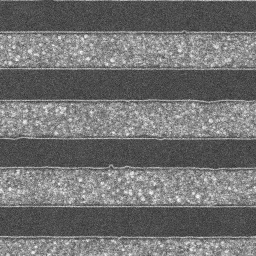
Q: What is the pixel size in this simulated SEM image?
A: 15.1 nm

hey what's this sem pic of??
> one or a few lines or trenches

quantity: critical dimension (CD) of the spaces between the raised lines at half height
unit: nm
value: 575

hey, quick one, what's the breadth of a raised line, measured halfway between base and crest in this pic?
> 0.471 µm